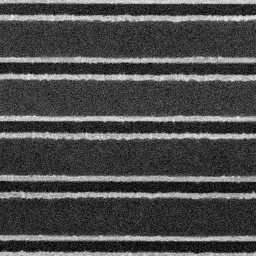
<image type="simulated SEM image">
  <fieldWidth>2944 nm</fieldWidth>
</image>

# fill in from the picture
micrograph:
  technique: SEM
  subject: lines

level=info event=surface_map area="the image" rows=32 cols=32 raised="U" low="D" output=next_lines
DDDDDDDDDDDDDDDDDDDDDDDDDDDDDDDD
DDDDDDDDDDDDDDDDDDDDDDDDDDDDDDDD
UUUUUUUUUUUUUUUUUUUUUUUUUUUUUUUU
UUUUUUUUUUUUUUUUUUUUUUUUUUUUUUUU
UUUUUUUUUUUUUUUUUUUUUUUUUUUUUUUU
UUUUUUUUUUUUUUUUUUUUUUUUUUUUUUUU
UUUUUUUUUUUUUUUUUUUUUUUUUUUUUUUU
DDDDDDDDDDDDDDUDUUUDDDDDDDDDDDDD
DDDDDDDDDDDDDDDDDDDDDDDDDDDDDDDD
DDDDDDDDDDDDDDDDDDDDDDDDDDDDDDDD
UUUUUUUUUUUUUUUUUUUUUUUUUUUUUUUU
UUUUUUUUUUUUUUUUUUUUUUUUUUUUUUUU
UUUUUUUUUUUUUUUUUUUUUUUUUUUUUUUU
UUUUUUUUUUUUUUUUUUUUUUUUUUUUUUUU
UUUUUUUUUUUUUUUUUUUUUUUUUUUUUUUU
DDDDDDDDDDDDDDDDDDDDDDDDDDDDDDDD
DDDDDDDDDDDDDDDDDDDDDDDDDDDDDDDD
UUUUUUUUUUUUUUUUUUUUUUUUUUUUUUUU
UUUUUUUUUUUUUUUUUUUUUUUUUUUUUUUU
UUUUUUUUUUUUUUUUUUUUUUUUUUUUUUUU
UUUUUUUUUUUUUUUUUUUUUUUUUUUUUUUU
UUUUUUUUUUUUUUUUUUUUUUUUUUUUUUUU
DDDDDDDDDDDDDDDDDDDDDDDDDDDDDDDD
DDDDDDDDDDDDDDDDDDDDDDDDDDDDDDDD
UUUUUUUUUUUUUUUUUUUUUUUUUUUUUUUU
UUUUUUUUUUUUUUUUUUUUUUUUUUUUUUUU
UUUUUUUUUUUUUUUUUUUUUUUUUUUUUUUU
UUUUUUUUUUUUUUUUUUUUUUUUUUUUUUUU
UUUUUUUUUUUUUUUUUUUUUUUUUUUUUUUU
UUUUUUUUUUUUUUUUUUUUUUUUUUUUUUUU
DDDDDDDDDDDDDDDDDDDDDDDDDDDDDDDD
DDDDDDDDDDDDDDDDDDDDDDDDDDDDDDDD